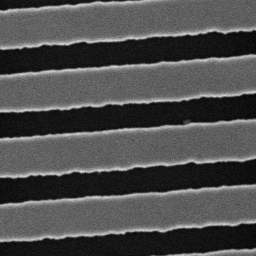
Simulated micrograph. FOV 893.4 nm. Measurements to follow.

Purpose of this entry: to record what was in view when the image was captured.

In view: lines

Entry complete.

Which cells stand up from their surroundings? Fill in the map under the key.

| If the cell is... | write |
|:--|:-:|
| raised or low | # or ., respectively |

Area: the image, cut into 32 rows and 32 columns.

...........#####################
################################
################################
################################
#######################.........
#########.......................
................................
........................########
...........#####################
################################
################################
################################
#######################.........
##########......................
................................
........................########
............####################
################################
################################
################################
#######################.........
#########.##....................
................................
.........................#######
..............##################
.###############################
################################
################################
#######################.........
##########.#....................
................................
...........................#####